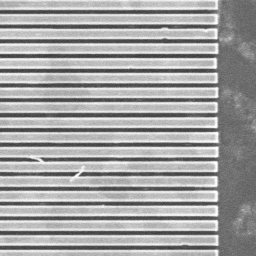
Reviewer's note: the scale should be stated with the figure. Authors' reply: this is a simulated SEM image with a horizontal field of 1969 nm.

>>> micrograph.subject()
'parallel lines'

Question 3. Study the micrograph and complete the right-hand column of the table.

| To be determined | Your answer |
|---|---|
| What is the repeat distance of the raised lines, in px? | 14.8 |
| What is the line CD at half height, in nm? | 68.3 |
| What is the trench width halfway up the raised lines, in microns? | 0.0452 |